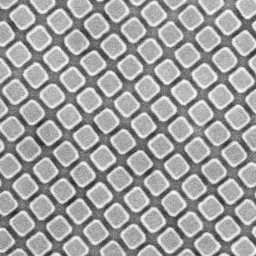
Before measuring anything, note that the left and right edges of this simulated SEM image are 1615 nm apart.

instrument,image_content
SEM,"a regular array of raised bodies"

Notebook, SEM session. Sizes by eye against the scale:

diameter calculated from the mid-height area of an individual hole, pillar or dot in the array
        136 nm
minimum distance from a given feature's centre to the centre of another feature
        164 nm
